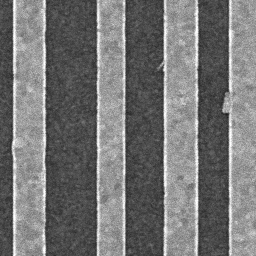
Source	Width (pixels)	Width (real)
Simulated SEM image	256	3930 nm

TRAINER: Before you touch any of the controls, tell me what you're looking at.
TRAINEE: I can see one or a few lines or trenches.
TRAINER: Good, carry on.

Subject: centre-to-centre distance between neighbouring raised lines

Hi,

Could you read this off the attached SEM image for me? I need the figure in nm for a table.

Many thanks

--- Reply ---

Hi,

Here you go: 1160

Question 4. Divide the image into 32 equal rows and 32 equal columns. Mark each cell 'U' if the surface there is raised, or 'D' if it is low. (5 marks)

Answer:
DDUUUUDDDDDDUUUUDDDDDUUUUDDDDUUU
DDUUUUDDDDDDUUUUDDDDDUUUUDDDDUUU
DDUUUUDDDDDDUUUDDDDDDUUUUDDDDUUU
DDUUUUDDDDDDUUUDDDDDDUUUUDDDDUUU
DDUUUUDDDDDDUUUDDDDDDUUUUDDDDUUU
DDUUUUDDDDDDUUUDDDDDDUUUUDDDDUUU
DDUUUUDDDDDDUUUUDDDDDUUUUDDDDUUU
DDUUUUDDDDDDUUUUDDDDDUUUUDDDDUUU
DDUUUUDDDDDDUUUDDDDDDUUUUDDDDUUU
DDUUUUDDDDDDUUUDDDDDDUUUUDDDDUUU
DDUUUUDDDDDDUUUDDDDDDUUUUDDDDUUU
DDUUUUDDDDDDUUUDDDDDDUUUUDDDDUUU
DDUUUUDDDDDDUUUDDDDDDUUUUDDDUUUU
DDUUUUDDDDDDUUUDDDDDDUUUUDDDUUUU
DDUUUUDDDDDDUUUDDDDDDUUUUDDDDUUU
DDUUUUDDDDDDUUUDDDDDDUUUUDDDDUUU
DDUUUUDDDDDDUUUDDDDDDUUUUDDDDUUU
DDUUUUDDDDDDUUUDDDDDDUUUUDDDDUUU
DDUUUUDDDDDDUUUDDDDDDUUUUDDDDUUU
DDUUUUDDDDDDUUUDDDDDDUUUUDDDDUUU
DDUUUDDDDDDDUUUUDDDDDUUUUDDDDUUU
DDUUUUDDDDDDUUUUDDDDDUUUUDDDDUUU
DDUUUUDDDDDDUUUDDDDDDUUUUDDDDUUU
DDUUUUDDDDDDUUUDDDDDDUUUUDDDDUUU
DDUUUUDDDDDDUUUDDDDDDUUUUDDDDUUU
DDUUUUDDDDDDUUUDDDDDDUUUUDDDDUUU
DDUUUUDDDDDDUUUDDDDDDUUUUDDDDUUU
DDUUUUDDDDDDUUUDDDDDDUUUUDDDDUUU
DDUUUUDDDDDDUUUDDDDDDUUUUDDDDUUU
DDUUUUDDDDDDUUUDDDDDDUUUUDDDDUUU
DDUUUUDDDDDDUUUDDDDDDUUUUDDDDUUU
DDUUUUDDDDDDUUUDDDDDDUUUUDDDDUUU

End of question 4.